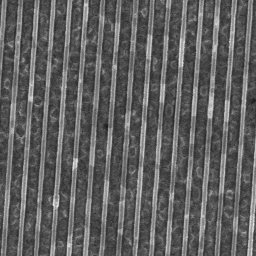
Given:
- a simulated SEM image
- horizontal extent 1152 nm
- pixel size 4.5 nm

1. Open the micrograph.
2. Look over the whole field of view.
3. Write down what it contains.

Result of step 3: parallel lines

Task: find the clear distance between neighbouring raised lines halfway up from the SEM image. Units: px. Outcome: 12.2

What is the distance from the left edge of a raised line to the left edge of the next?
73.7 nanometres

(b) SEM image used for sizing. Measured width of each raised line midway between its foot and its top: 15.7 nanometres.